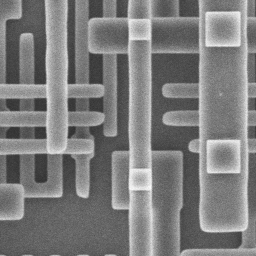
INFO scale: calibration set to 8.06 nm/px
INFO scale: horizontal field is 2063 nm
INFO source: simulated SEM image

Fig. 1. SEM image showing wiring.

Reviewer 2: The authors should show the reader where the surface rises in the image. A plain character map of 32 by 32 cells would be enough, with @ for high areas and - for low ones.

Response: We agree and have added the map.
------@@--------@@@------@@@@@@-
------@@--------@@@------@@@@@@-
------@@--------@@@------@@@@@@-
------@@--------@@@------@@@@@@-
------@@--------@@@------@@@@@@-
------@@--------@@@------@@@@@@-
------@@--------@@@------@@@@@@-
------@@--------@@@------@@@@@@-
------@@--------@@@------@@@@@@-
------@@--------@@@------@@@@@@-
------@@--------@@@------@@@@@@-
------@@--------@@@------@@@@@@-
------@@--------@@@------@@@@@@-
------@@--------@@@------@@@@@@-
------@@--------@@@------@@@@@@-
------@@--------@@@------@@@@@@-
------@@--------@@@------@@@@@@-
------@@--------@@@------@@@@@@-
------@@--------@@@------@@@@@@-
----------------@@@------@@@@@@-
----------------@@@------@@@@@@-
----------------@@@------@@@@@@-
----------------@@@------@@@@@@-
----------------@@@------@@@@@@-
----------------@@@------@@@@@@-
----------------@@@------@@@@@@-
----------------@@@------@@@@@@-
----------------@@@------@@@@@@-
----------------@@@------@@@@@@-
----------------@@@-------------
----------------@@@-------------
----------------@@@-------------